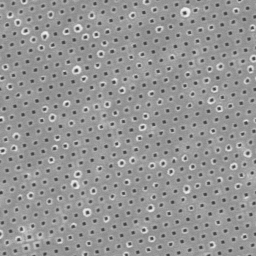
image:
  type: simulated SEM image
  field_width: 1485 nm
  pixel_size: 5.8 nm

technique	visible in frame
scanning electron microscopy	a regular array of holes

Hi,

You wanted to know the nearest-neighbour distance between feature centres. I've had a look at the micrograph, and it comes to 63.5 nanometers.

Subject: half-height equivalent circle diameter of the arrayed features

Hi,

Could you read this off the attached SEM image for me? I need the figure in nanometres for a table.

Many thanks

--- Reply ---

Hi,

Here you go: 21.7